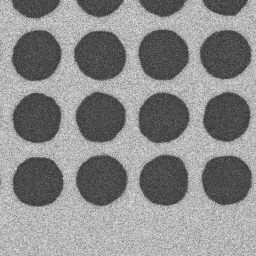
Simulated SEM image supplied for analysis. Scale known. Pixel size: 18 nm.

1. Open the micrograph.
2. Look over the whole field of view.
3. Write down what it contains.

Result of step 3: a regular array of holes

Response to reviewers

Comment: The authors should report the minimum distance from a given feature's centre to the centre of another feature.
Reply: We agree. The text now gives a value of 1.12 µm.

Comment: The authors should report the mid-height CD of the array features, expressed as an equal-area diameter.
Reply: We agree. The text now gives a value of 904 nm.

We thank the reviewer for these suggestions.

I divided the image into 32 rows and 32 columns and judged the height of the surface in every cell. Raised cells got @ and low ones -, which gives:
@@-----@@@-----@@@-----@@@-----@
@@----@@@@@---@@@@@---@@@@@---@@
@@@@@@@@@@@@@@@@@@@@@@@@@@@@@@@@
@@@@@@@@@@@@@@@@@@@@@@@@@@@@@@@@
@@@----@@@@----@@@----@@@@----@@
@@-----@@@-----@@@-----@@------@
@@------@-------@-------@------@
@@------@-------@-------@------@
@@-----@@@-----@@@-----@@@-----@
@@@---@@@@@----@@@@---@@@@@---@@
@@@@@@@@@@@@@@@@@@@@@@@@@@@@@@@@
@@@@@@@@@@@@@@@@@@@@@@@@@@@@@@@@
@@@----@@@-----@@@-----@@@-----@
@@------@@------@@-----@@@-----@
@@------@-------@-------@------@
@@------@@------@-------@------@
@@-----@@@-----@@@-----@@@-----@
@@@---@@@@@---@@@@@---@@@@@--@@@
@@@@@@@@@@@@@@@@@@@@@@@@@@@@@@@@
@@@@@@@@@@@@--@@@@@@--@@@@@@-@@@
@@@----@@@-----@@@-----@@@-----@
@@------@@------@@-----@@------@
@@------@-------@-------@------@
@@------@@------@@-----@@------@
@@-----@@@-----@@@-----@@@-----@
@@@---@@@@@@--@@@@@---@@@@@--@@@
@@@@@@@@@@@@@@@@@@@@@@@@@@@@@@@@
@@@@@@@@@@@@@@@@@@@@@@@@@@@@@@@@
@@@@@@@@@@@@@@@@@@@@@@@@@@@@@@@@
@@@@@@@@@@@@@@@@@@@@@@@@@@@@@@@@
@@@@@@@@@@@@@@@@@@@@@@@@@@@@@@@@
@@@@@@@@@@@@@@@@@@@@@@@@@@@@@@@@